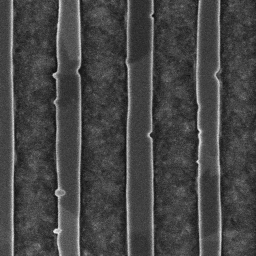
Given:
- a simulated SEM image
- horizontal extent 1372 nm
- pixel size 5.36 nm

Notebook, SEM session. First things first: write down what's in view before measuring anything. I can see one or a few lines or trenches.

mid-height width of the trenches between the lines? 244 nm